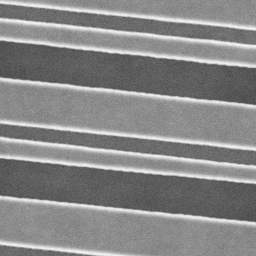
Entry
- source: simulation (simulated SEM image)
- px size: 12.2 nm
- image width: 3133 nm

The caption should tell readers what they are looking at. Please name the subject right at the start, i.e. lines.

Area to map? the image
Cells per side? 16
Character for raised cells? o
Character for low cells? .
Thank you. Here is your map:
oooooooooooooooo
oooooooooooooooo
oooooooooooooooo
.........ooooooo
................
oooooo..........
ooooooooooooooo.
oooooooooooooooo
oooooooooooooooo
oooooooooooooooo
......oooooooooo
................
oo..............
oooooooooooo....
oooooooooooooooo
oooooooooooooooo